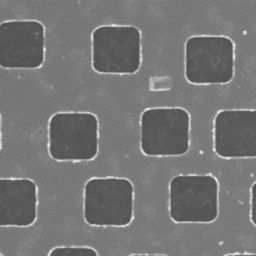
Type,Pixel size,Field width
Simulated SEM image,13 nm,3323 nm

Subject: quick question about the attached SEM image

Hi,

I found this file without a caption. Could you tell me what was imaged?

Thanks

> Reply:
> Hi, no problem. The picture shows holes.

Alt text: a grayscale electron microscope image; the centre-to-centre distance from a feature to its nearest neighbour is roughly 0.969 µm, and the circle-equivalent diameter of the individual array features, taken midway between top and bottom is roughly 0.667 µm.